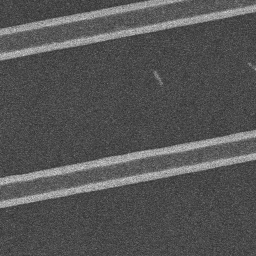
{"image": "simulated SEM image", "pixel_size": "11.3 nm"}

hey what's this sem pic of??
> one or a few lines or trenches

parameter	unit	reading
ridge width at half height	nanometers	277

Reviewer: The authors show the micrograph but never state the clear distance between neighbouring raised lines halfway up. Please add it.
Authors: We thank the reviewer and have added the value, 1370 nanometers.